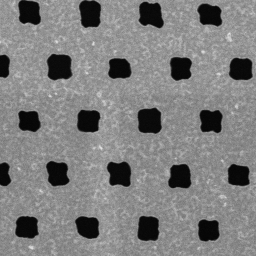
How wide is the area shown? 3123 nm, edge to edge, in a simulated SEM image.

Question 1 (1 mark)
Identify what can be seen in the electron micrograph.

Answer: a regular array of holes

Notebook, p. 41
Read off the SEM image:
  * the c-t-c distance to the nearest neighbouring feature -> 733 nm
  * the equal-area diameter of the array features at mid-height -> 288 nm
